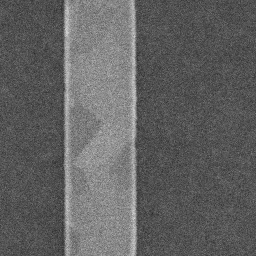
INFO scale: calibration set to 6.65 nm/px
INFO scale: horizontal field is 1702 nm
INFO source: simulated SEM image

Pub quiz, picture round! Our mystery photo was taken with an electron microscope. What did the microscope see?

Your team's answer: one or a few lines or trenches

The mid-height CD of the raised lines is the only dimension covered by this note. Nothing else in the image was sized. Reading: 0.439 microns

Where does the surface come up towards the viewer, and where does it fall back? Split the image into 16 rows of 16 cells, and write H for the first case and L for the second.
LLLLHHHHLLLLLLLL
LLLLHHHHLLLLLLLL
LLLLHHHHLLLLLLLL
LLLLHHHHLLLLLLLL
LLLLHHHHLLLLLLLL
LLLLHHHHLLLLLLLL
LLLLHHHHLLLLLLLL
LLLLHHHHLLLLLLLL
LLLLHHHHLLLLLLLL
LLLLHHHHLLLLLLLL
LLLLHHHHLLLLLLLL
LLLLHHHHLLLLLLLL
LLLLHHHHLLLLLLLL
LLLLHHHHLLLLLLLL
LLLLHHHHLLLLLLLL
LLLLHHHHLLLLLLLL